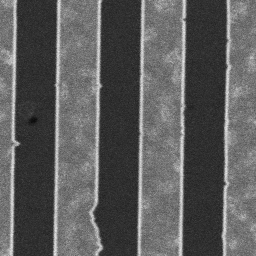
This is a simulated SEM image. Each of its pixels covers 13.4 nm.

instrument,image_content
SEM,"one or a few lines or trenches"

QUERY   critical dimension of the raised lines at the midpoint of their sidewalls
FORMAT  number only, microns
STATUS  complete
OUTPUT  0.552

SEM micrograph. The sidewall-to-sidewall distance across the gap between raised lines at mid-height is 592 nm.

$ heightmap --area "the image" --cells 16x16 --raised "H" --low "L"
HLLLHHLLLHHHLLHH
HLLLHHLLLHHLLLHH
HLLLHHLLLHHLLLHH
HLLLHHLLLHHLLLHH
HLLLHHLLLHHLLLHH
HLLLHHLLLHHLLLHH
HLLLHHLLLHHLLLHH
HLLLHHLLLHHLLLHH
HLLLHHLLLHHLLLHH
HLLLHHLLLHHLLLHH
HLLLHHLLLHHLLLHH
HLLLHHLLLHHLLLHH
HLLLHHLLLHHLLLHH
HLLLHHLLLHHLLLHH
HLLHHHLLLHHLLLHH
HLLHHHLLLHHLLLHH